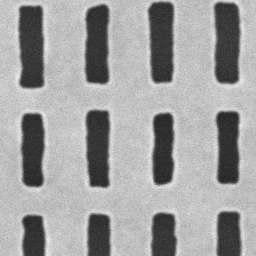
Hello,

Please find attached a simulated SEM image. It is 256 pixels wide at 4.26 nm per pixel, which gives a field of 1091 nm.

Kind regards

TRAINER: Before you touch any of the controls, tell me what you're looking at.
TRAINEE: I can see holes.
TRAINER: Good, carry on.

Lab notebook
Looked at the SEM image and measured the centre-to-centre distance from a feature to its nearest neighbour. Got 277 nanometers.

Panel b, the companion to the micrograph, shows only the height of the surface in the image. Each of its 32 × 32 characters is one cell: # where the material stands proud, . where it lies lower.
############.######..######..###
##...######...####....#####...##
##...######...#####...#####...##
##...######...#####...#####...##
##...######...#####...#####...##
##....#####...#####...#####...##
##...######...#####...#####...##
###..######..######...#####...##
###...#####...#####...#####...##
###..######...#####...#####...##
##...#######################.###
################################
################################
################################
###..######...#####...#####...##
###...#####...#####...#####...##
###...#####...#####...#####...##
###...#####...#####...#####...##
###...#####...#####...#####...##
###..######...#####...#####...##
###..######..######...#####...##
###..######...#####...#####...##
###..######...#####..######...##
################################
################################
################################
############################..##
###..######...#####...#####...##
###...#####...#####...#####...##
###...#####...#####...#####...##
###...#####...#####...#####...##
###...#####...#####...#####...##